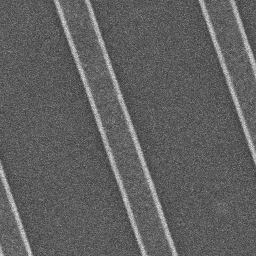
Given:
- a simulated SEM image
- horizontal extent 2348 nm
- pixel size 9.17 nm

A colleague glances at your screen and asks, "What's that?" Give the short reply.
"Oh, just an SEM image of one or a few lines or trenches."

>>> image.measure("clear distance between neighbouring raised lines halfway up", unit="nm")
992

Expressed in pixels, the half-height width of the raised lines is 28.7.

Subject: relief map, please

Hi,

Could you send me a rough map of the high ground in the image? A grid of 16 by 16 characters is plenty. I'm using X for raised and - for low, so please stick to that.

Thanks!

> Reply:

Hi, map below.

----XX-------XX-
----XX-------XX-
----XX-------XX-
-----XX-------XX
-----XX-------XX
-----XX-------XX
------XX-------X
------XX-------X
------XX-------X
-------XX-------
-------XX-------
--------X-------
X-------XX------
X-------XX------
X--------X------
XX-------XX-----